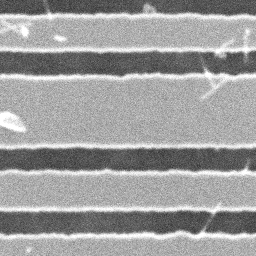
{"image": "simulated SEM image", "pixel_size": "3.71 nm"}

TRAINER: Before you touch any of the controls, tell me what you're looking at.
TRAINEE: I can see lines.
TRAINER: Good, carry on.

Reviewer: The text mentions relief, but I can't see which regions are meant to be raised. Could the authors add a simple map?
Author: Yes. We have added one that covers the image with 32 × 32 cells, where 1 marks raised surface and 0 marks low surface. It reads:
00000000000000000000000000000000
00000000000000000000000000000000
11111111111111111111111111111111
11111111111111111111111111111111
11111111111111111111111111111111
11111111111111111111111111111111
00000100000010000000000000010000
00000000000000000000000000000000
00000000000000000000000000000000
11100000011110001111111111111011
11111111111111111111111111111111
11111111111111111111111111111111
11111111111111111111111111111111
11111111111111111111111111111111
11111111111111111111111111111111
11111111111111111111111111111111
11111111111111111111111111111111
11111111111111111111111111111111
00000000000000000000000000000000
00000000000000000000000000000000
00000000000000000000000000000000
11101111101111110011011101100110
11111111111111111111111111111111
11111111111111111111111111111111
11111111111111111111111111111111
11111111111111111111111111111111
00000000000000000000000000000000
00000000000000000000000000000000
00000000000000000000000000000000
11111111111111111111111111111111
11111111111111111111111111111111
11111111111111111111111111111111